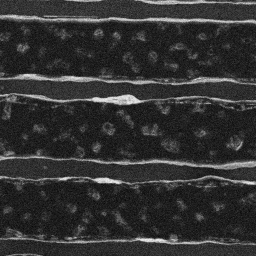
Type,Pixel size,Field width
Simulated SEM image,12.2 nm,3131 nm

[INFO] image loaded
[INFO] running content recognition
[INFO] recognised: one or a few lines or trenches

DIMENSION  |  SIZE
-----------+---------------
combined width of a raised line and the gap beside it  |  981 nm